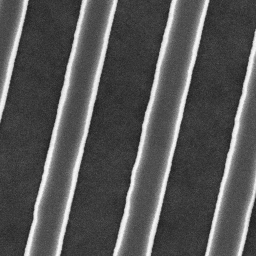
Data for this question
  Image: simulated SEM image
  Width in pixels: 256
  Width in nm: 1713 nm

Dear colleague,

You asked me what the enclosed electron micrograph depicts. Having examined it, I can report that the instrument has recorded lines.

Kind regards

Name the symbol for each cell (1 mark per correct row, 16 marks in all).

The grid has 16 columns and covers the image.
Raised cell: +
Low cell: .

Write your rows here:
++...++....++...
+....++....++...
+....++...++....
+...++....++....
+...++....++...+
....++....++...+
....++...+++...+
....++...++....+
...++....++....+
...++....++...++
...++...+++...++
...++...++....++
..++....++....++
..++....++...+++
..++....++...++.
..++...++....++.